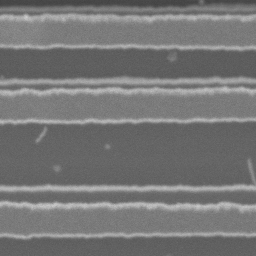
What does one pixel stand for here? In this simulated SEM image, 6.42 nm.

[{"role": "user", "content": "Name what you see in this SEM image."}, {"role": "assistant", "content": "lines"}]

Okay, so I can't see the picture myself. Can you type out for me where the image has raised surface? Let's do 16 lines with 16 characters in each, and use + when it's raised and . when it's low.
................
++++++++++++++++
++++++++++++++++
................
................
++++++++++++++++
++++++++++++++++
++++++++++++.+..
................
................
................
................
++++++++++++++++
++++++++++++++++
++++++++++++++++
................